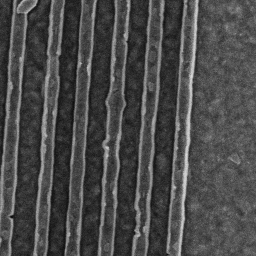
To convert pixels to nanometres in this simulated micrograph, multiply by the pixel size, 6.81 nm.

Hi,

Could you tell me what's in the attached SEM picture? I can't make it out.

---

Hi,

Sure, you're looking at parallel lines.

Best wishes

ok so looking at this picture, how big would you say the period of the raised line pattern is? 230 nanometres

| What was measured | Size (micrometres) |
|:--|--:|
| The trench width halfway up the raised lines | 0.14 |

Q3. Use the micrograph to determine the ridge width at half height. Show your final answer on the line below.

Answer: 89.2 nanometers